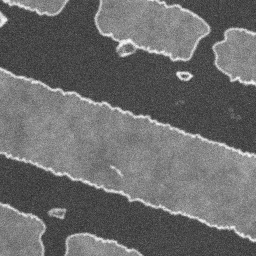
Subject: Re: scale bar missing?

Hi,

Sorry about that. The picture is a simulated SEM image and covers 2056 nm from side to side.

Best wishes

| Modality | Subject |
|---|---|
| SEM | one or a few lines or trenches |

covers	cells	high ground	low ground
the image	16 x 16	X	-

XX--XX-----XXXXX
XXXXXX-------XXX
XXXXXXXX----XX--
XXXXXXXXXXX-X---
XXXXXXXXXXXXXX--
---XXXXXXXXXXXXX
------XXXXXXXXXX
---------XXXXXXX
------------XXXX
---------------X
XXX-------------
XXXXXX----------
XXXXXXXXX-------
--XXXXXXXXXX----
---XXXXXXXXXXXX-
---X----XXXXXXXX